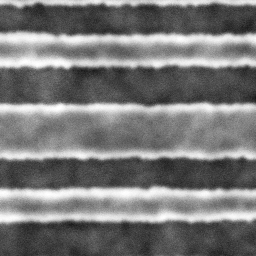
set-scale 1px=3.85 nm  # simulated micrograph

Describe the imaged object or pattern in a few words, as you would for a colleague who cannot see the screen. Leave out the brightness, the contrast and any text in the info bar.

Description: lines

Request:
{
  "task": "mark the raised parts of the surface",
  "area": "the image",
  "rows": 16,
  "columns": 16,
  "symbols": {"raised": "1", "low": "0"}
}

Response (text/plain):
0000000000000000
0000000000000000
1111111111111111
1111111111111111
0000000000000000
0000000000000000
0000000000000000
1111111111111111
1111111111111111
1111111111111111
0000000000000000
0000000000000000
1111111111111111
1111111111111111
0000000000000000
0000000000000000